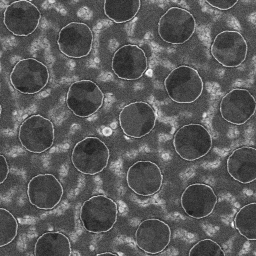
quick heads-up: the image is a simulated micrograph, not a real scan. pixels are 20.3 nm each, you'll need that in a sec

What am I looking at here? a regular array of raised bodies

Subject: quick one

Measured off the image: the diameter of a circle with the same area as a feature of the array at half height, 729 nanometres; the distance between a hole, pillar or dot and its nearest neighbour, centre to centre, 1170 nanometers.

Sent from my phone